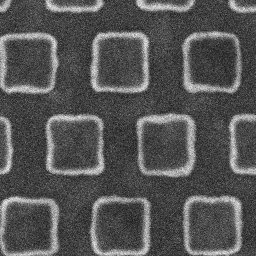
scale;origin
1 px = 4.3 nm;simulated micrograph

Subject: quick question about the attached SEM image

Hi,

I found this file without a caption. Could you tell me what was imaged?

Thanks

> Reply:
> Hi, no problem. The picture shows raised bodies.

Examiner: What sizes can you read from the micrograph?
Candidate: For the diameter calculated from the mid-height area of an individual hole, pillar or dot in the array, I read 262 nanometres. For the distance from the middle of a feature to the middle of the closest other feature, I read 393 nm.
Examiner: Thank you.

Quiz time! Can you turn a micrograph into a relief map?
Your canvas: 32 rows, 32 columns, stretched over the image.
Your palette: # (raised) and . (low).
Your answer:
#.....######......######.....###
................................
................................
................................
.#..##......######.......####...
#######.....######.....#######..
#######.....######.....#######..
#######.....######.....#######..
#######.....######.....#######..
#######.....######.....#######..
#######.....######.....#######..
................................
................................
................................
................................
#.....#######.....######.....###
#.....#######....#######.....###
#.....#######....#######.....###
#.....#######....#######.....###
#.....#######....#######.....###
#.....#######....#######.....###
#......#####......#####.........
................................
................................
................................
#######.....######......######..
#######.....######.....#######..
#######.....######.....#######..
#######.....######.....#######..
#######.....######.....#######..
#######.....######.....#######..
######......######......#####...